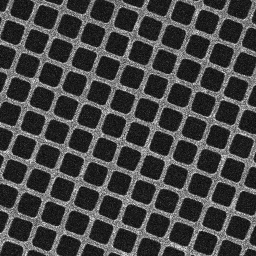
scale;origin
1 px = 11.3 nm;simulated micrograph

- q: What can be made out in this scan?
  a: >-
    a regular array of holes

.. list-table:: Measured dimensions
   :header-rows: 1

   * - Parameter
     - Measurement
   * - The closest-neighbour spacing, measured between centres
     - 284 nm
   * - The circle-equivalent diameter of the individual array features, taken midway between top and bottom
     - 0.264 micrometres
